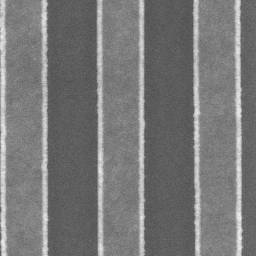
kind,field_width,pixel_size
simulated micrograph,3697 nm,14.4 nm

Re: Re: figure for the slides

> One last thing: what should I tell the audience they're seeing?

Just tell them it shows lines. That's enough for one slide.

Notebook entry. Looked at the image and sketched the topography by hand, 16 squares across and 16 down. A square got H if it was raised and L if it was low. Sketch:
HHHLLLHHHLLLHHHL
HHHLLLHHHLLLHHHL
HHHLLLHHHLLLHHHL
HHHLLLHHHLLLHHHL
HHHLLLHHHLLLHHHL
HHHLLLHHHLLLHHHL
HHHLLLHHHLLLHHHL
HHHLLLHHHLLLHHHL
HHHLLLHHHLLLHHHL
HHHLLLHHHLLLHHHL
HHHLLLHHHLLLHHHL
HHHLLLHHHLLLHHHL
HHHLLLHHHLLLHHHL
HHHLLLHHHLLLHHHL
HHHLLLHHHLLLHHHL
HHHLLLHHHLLLHHHL